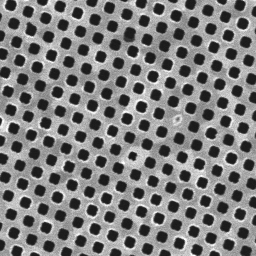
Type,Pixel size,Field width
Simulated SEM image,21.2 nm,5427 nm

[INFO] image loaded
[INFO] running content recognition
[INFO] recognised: a regular array of holes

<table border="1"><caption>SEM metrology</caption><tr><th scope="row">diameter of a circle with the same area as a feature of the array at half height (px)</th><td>11.9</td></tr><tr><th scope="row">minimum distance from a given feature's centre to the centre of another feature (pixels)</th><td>18.5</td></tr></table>